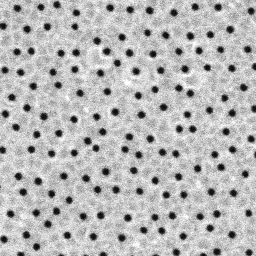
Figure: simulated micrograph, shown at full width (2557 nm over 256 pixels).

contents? a regular array of holes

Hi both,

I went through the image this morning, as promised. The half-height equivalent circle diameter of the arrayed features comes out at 0.0773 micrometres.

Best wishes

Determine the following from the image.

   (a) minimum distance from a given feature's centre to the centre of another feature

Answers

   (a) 177 nm